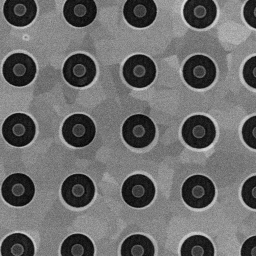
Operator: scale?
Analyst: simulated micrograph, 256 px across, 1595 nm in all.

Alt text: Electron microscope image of an array of small figures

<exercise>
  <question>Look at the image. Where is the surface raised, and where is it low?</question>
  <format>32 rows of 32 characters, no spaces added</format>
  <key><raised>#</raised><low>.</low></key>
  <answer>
.....###....####...####....####.
.....###....###.....###....###..
#...####....####...####....####.
#################.######..######
################################
################################
##.#############################
#...####....####...####...#####.
.....###....###.....###....###..
....####....###....####....###..
#...#####..#####...####....####.
################################
################################
################################
#...#####..#####..######..#####.
....####....###....####....###..
.....###....###.....###....###..
#...####....###....####....###..
################..######..#####.
################################
################################
################################
#...####...#####...####...#####.
....####....###....####....###..
....####....###....####....###..
#..#####...#####...####...#####.
################################
################################
################################
#..######..#####..######..######
....####....###....####....###..
....###.....###....###.....###..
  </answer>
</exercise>